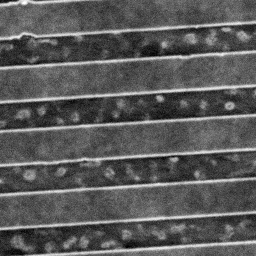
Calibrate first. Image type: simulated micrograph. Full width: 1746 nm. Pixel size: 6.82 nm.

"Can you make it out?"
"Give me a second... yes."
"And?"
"parallel lines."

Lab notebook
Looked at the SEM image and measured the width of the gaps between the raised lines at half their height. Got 0.19 microns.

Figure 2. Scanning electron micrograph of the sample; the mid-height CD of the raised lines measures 35.2 pixels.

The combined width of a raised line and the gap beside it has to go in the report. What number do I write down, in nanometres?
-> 431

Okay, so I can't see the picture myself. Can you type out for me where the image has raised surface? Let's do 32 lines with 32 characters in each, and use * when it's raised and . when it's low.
.*******************************
********************************
********************************
**********************..........
***.***.........................
................................
...............................*
...............*****************
********************************
********************************
********************************
*********************...........
*****...........................
................................
.............................***
..............******************
********************************
********************************
********************************
*******************.............
****............................
................................
............................****
............********************
********************************
********************************
********************************
******************..............
**..............................
................................
...........................*****
.............*******************